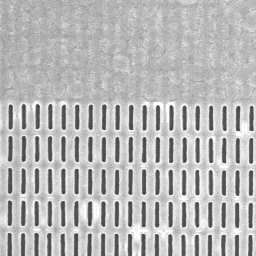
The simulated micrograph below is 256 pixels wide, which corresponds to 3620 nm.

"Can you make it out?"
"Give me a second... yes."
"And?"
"a regular array of holes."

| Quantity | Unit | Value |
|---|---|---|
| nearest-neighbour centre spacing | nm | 190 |